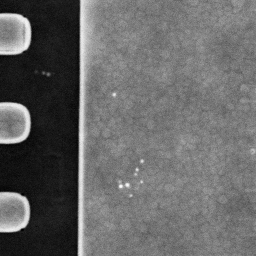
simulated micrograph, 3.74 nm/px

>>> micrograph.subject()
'wiring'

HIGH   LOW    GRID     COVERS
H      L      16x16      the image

LLLLLHHHHHHHHHHH
HHLLLHHHHHHHHHHH
HHLLLHHHHHHHHHHH
LLLLLHHHHHHHHHHH
LLLLLHHHHHHHHHHH
LLLLLHHHHHHHHHHH
HLLLLHHHHHHHHHHH
HHLLLHHHHHHHHHHH
HLLLLHHHHHHHHHHH
LLLLLHHHHHHHHHHH
LLLLLHHHHHHHHHHH
LLLLLHHHHHHHHHHH
HLLLLHHHHHHHHHHH
HHLLLHHHHHHHHHHH
LLLLLHHHHHHHHHHH
LLLLLHHHHHHHHHHH